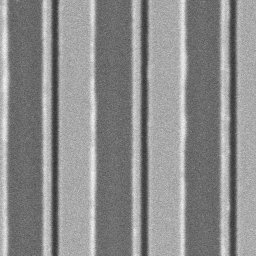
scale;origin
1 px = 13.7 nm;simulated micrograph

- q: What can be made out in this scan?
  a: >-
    lines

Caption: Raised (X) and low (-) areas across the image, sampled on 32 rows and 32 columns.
X-----XXXXXX-----XXXXXX-----XXXX
X-----XXXXXX-----XXXXXX-----XXXX
X-----XXXXXX-----XXXXXX-----XXXX
X-----XXXXXX-----XXXXXX-----XXXX
X-----XXXXXX-----XXXXXX-----XXXX
X-----XXXXXX-----XXXXXX-----XXXX
X-----XXXXXX-----XXXXXX-----XXXX
X-----XXXXXX-----XXXXXX-----XXXX
X-----XXXXXX-----XXXXXX-----XXXX
X-----XXXXXX-----XXXXXX-----XXXX
X-----XXXXXX-----XXXXXX-----XXXX
X-----XXXXXX-----XXXXXX-----XXXX
X-----XXXXXX-----XXXXXX-----XXXX
X-----XXXXXX-----XXXXXX-----XXXX
X-----XXXXXX-----XXXXXX-----XXXX
X-----XXXXXX-----XXXXXX-----XXXX
X-----XXXXXX-----XXXXXX-----XXXX
X-----XXXXXX-----XXXXXX-----XXXX
X-----XXXXXX-----XXXXXX-----XXXX
X-----XXXXXX-----XXXXXX-----XXXX
X-----XXXXXX-----XXXXXX-----XXXX
X-----XXXXXX-----XXXXXX-----XXXX
X-----XXXXXX-----XXXXXX-----XXXX
X-----XXXXXX-----XXXXXX-----XXXX
X-----XXXXXX-----XXXXXX-----XXXX
X-----XXXXXX-----XXXXXX-----XXXX
X-----XXXXXX-----XXXXXX-----XXXX
X-----XXXXXX-----XXXXXX-----XXXX
X-----XXXXXX-----XXXXXX-----XXXX
X-----XXXXXX-----XXXXXX-----XXXX
X-----XXXXXX-----XXXXXX-----XXXX
X-----XXXXXX-----XXXXXX-----XXXX